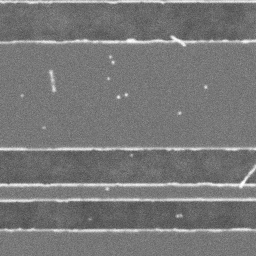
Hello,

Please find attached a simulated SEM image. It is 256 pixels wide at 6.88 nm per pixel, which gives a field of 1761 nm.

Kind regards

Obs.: lines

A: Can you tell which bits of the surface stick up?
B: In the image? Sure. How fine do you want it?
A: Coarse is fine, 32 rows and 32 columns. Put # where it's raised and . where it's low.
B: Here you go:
................................
................................
................................
................................
................................
################################
################################
################################
################################
################################
################################
################################
################################
################################
################################
################################
################################
################################
################################
................................
................................
................................
................................
################################
################################
................................
................................
................................
................................
################################
################################
################################